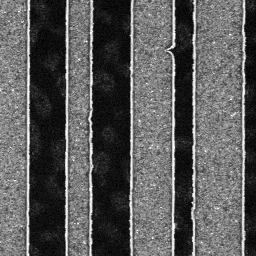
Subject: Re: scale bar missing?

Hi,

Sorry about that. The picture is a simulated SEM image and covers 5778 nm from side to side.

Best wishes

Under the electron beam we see one or a few lines or trenches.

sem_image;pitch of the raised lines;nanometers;1540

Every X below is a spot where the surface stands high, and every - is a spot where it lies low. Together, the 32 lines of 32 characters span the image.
----XXXX---XXXXXX-----XX------XX
----XXXX---XXXXXX-----XX-------X
----XXXX---XXXXXX-----XX------XX
----XXXX---XXXXXX-----XX------XX
----XXXX---XXXXXX-----XX------XX
----XXXX---XXXXXX-----XX------XX
----XXXX---XXXXXX----XXX------XX
----XXXX---XXXXXX-----XX------XX
----XXXX---XXXXXX-----XX------XX
----XXXX---XXXXX------XX------XX
----XXXX---XXXXX------XX------XX
----XXXX---XXXXX------XX------XX
----XXXX---XXXXX------XX------XX
----XXXX---XXXXX------XX------XX
----XXXX---XXXXX------XX------XX
----XXXX---XXXXX------XX------XX
----XXXX---XXXXX------XX------XX
----XXXX---XXXXX------XX------XX
----XXXX---XXXXX------XX------XX
---XXXXX---XXXXX------XX------XX
---XXXXX---XXXXX------XX------XX
---XXXXX---XXXXX------XX------XX
---XXXXX---XXXXX------XX------XX
---XXXXX---XXXXX------XX------XX
---XXXXX---XXXXX------XX------XX
---XXXXX---XXXXX------XX------XX
---XXXXX---XXXXX------XX------XX
---XXXXX---XXXXX------XX------XX
---XXXXX---XXXXX------XX------XX
---XXXXX---XXXXX------XX------XX
---XXXXX---XXXXX------XX------XX
---XXXXX---XXXXX------XX------XX